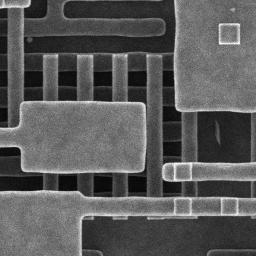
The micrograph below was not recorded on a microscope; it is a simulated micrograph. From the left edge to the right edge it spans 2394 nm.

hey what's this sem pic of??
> wiring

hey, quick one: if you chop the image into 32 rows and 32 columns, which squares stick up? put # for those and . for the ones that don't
####..................##########
.##...................##########
.##...................##########
.##...................##########
.##...................##########
.##...................##########
.##...................##########
.##..##...##..##..##..##########
.##..##...##..##..##..##########
.##..##...##..##..##..##########
.##..##...##..##..##..##########
.##..##...##..##..##..##########
.##..###.###..##..##..##########
.###################..##########
.###################...##......#
.###################...##......#
####################...##......#
####################...##......#
..##################...##......#
...#################...##......#
...##########################.##
.....#######..###.##############
.....##...##..##..########....##
.....##...##..##..##...##......#
############..##..###.###......#
################################
################################
###########.....................
##########......................
##########......................
##########......................
##########......................